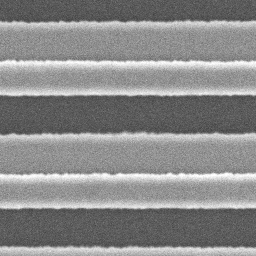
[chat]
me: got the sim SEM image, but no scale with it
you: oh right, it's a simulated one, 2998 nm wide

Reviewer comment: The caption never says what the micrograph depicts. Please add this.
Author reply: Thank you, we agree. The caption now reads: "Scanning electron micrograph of lines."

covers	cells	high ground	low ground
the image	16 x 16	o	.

................
oooooooooooooooo
oooooooooooooooo
oooooooooooooooo
oooooooooooooooo
oooooooooooooooo
................
................
oooooooooooooooo
oooooooooooooooo
oooooooooooooooo
oooooooooooooooo
oooooooooooooooo
................
................
................